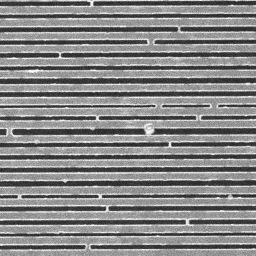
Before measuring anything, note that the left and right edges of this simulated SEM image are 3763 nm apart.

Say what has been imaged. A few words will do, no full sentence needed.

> parallel lines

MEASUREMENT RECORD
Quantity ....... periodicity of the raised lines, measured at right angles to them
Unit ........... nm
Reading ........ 188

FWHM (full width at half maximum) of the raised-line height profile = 0.119 micrometres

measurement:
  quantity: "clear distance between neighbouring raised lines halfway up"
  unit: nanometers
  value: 73.5